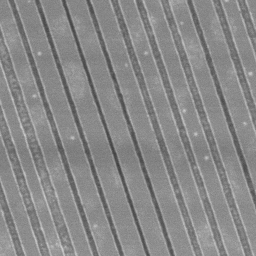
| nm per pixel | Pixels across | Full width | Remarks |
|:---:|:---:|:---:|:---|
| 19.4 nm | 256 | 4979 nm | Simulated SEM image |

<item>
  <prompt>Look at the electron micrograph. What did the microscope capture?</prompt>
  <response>parallel lines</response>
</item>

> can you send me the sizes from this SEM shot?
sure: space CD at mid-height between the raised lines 0.15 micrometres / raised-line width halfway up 323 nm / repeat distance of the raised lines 0.469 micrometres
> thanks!